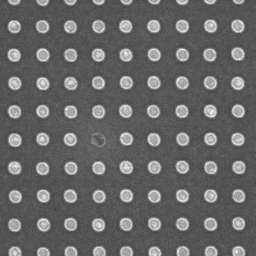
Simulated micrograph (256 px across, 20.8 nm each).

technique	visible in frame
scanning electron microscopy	a regular array of raised bodies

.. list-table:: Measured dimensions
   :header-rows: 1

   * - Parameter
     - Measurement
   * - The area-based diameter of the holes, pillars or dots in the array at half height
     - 251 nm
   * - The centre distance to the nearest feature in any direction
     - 572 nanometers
